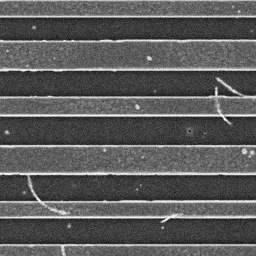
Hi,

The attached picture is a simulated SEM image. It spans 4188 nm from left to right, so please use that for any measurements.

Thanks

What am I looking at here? lines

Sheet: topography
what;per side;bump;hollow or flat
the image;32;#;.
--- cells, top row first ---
################################
################################
................................
................................
................................
################################
################################
################################
################################
................................
................................
................................
################################
################################
...........................##...
................................
................................
................................
################################
################################
################################
################################
................................
................................
................................
################################
################################
................................
................................
................................
................................
################################